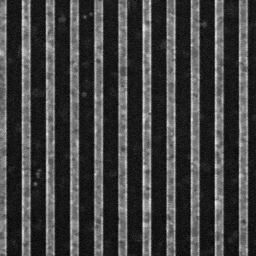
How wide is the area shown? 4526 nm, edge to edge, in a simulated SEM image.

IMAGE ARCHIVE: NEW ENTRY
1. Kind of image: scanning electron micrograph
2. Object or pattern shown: parallel lines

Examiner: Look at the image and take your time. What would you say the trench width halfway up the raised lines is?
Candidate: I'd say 305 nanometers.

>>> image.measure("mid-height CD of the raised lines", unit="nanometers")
122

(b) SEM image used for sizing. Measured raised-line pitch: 427 nm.